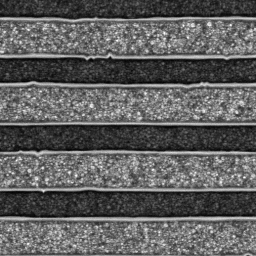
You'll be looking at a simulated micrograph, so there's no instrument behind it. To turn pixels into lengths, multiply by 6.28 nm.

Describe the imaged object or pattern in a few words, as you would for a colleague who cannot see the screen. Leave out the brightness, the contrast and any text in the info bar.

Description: one or a few lines or trenches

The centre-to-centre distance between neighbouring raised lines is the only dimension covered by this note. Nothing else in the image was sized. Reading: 0.418 um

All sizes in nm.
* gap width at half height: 172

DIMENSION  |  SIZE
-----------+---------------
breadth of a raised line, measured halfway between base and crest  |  245 nm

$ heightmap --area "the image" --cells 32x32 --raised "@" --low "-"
--------------------------------
--------------------------------
@@@@@@@@@@@@@@@@@@@@@@@@@@@@@@@@
@@@@@@@@@@@@@@@@@@@@@@@@@@@@@@@@
@@@@@@@@@@@@@@@@@@@@@@@@@@@@@@@@
@@@@@@@@@@@@@@@@@@@@@@@@@@@@@@@@
@@@@@@@@@@@@@@@@@@@@@@@@@@@@@@@@
--------------------------------
--------------------------------
--------------------------------
--@@@--------------------@------
@@@@@@@@@@@@@@@@@@@@@@@@@@@@@@@@
@@@@@@@@@@@@@@@@@@@@@@@@@@@@@@@@
@@@@@@@@@@@@@@@@@@@@@@@@@@@@@@@@
@@@@@@@@@@@@@@@@@@@@@@@@@@@@@@@@
@@@@@@-----------@@@@@@@@@@@@@@@
--------------------------------
--------------------------------
--------------------------------
@@@@@@@@@@@@@@@@@@@@@@@@@@@@@@@@
@@@@@@@@@@@@@@@@@@@@@@@@@@@@@@@@
@@@@@@@@@@@@@@@@@@@@@@@@@@@@@@@@
@@@@@@@@@@@@@@@@@@@@@@@@@@@@@@@@
@@@@@@@@@@@@@@@@@@@@@@@@@@@@@@@@
--------------------------------
--------------------------------
--------------------------------
@@@@@@@@@@@@@@@@@@@@@@@@@@@@@@@@
@@@@@@@@@@@@@@@@@@@@@@@@@@@@@@@@
@@@@@@@@@@@@@@@@@@@@@@@@@@@@@@@@
@@@@@@@@@@@@@@@@@@@@@@@@@@@@@@@@
@@@@@@@@@@@@@@@@@@@@@@@@@@@@@@@@